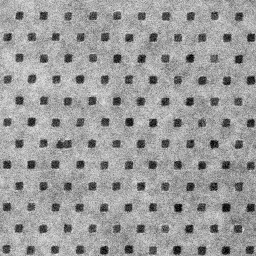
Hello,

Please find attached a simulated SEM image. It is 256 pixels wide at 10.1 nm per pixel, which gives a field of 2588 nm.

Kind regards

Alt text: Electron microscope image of a regular array of raised bodies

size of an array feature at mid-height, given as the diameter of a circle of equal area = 10.5 px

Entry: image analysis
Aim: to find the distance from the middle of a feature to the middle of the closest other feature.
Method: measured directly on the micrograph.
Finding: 0.242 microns